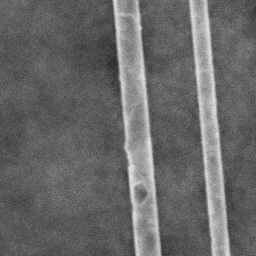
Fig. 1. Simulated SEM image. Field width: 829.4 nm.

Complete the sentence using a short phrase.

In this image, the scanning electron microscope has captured one or a few lines or trenches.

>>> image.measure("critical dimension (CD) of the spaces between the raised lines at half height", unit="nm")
167